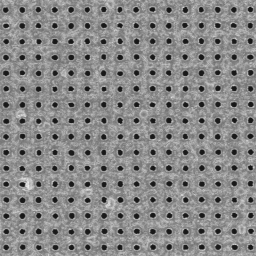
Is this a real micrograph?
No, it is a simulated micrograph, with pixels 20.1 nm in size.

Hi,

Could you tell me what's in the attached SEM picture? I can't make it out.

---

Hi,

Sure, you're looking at a regular array of holes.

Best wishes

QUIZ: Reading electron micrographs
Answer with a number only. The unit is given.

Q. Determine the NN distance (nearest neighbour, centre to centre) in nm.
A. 315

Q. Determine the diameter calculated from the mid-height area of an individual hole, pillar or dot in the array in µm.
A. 0.113